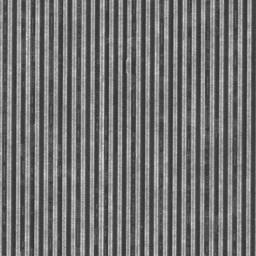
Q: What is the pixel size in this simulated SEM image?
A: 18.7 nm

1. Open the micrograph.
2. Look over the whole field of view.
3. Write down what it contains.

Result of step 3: parallel lines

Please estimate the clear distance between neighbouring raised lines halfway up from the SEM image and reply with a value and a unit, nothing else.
5 pixels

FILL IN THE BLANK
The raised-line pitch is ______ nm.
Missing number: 173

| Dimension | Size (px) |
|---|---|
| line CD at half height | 4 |